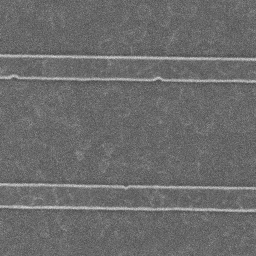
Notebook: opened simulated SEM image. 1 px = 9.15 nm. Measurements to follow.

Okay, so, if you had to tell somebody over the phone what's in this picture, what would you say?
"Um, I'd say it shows one or a few lines or trenches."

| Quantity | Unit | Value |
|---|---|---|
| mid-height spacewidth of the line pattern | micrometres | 0.976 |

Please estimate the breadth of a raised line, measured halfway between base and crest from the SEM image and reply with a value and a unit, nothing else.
0.207 µm